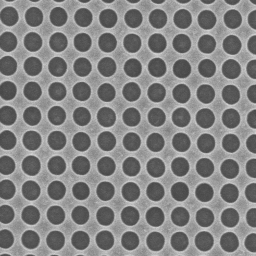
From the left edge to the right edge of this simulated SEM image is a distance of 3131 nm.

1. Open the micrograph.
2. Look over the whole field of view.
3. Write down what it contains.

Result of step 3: a regular array of holes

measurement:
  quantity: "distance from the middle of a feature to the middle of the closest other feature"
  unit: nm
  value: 296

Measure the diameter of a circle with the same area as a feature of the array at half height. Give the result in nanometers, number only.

236